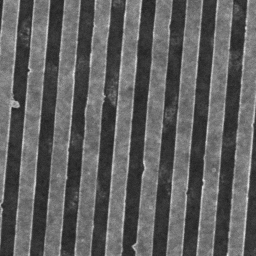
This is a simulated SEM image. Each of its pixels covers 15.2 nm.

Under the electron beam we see parallel lines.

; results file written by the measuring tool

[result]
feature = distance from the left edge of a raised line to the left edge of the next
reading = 462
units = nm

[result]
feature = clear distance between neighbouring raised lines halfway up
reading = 233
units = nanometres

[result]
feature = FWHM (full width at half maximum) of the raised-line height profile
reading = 233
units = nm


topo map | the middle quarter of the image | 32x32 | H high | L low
HHHLLLLHHHLLLLHHHHLLLLHHHHLLLHHH
HHHLLLLHHHLLLLHHHHLLLLHHHHLLLHHH
HHLLLLHHHHLLLLHHHHLLLLHHHLLLLHHH
HHLLLLHHHHLLLLHHHHLLLLHHHLLLLHHH
HHLLLLHHHHLLLLHHHHLLLLHHHLLLLHHH
HHLLLLHHHHLLLLHHHHLLLLHHHLLLLHHH
HHLLLLHHHHLLLLHHHLLLLHHHHLLLLHHH
HHLLLLHHHHLLLLHHHLLLLHHHHLLLLHHH
HHLLLLHHHHLLHLHHHLLLLHHHHLLLLHHH
HHLLLLHHHHLLLLHHHLLLLHHHHLLLLHHH
HHLLLLHHHLLLLHHHHLLLLHHHHLLLLHHH
HHLLLLHHHLLLLHHHHLLLLHHHHLLLLHHH
HHLLLHHHHLLLLHHHHLLLLHHHHLLLHHHH
HHLLLHHHHLLLLHHHHLLLLHHHHLLLHHHH
HHLLLHHHHLLLLHHHHLLLLHHHLLLLHHHH
HHLLLHHHHLLLLHHHHLLLLHHHLLLLHHHH
HHLLLHHHHLLLLHHHHLLLLHHHLLLLHHHH
HLLLLHHHHLLLLHHHHLLLLHHHLLLLHHHH
HLLLLHHHHLLLLHHHLLLLLHHHLLLLHHHH
HLLLLHHHHLLLLHHHLLLLHHHHLLLLHHHH
HLLLLHHHHLLLLHHHLLLLHHHHLLLLHHHL
HLLLLHHHHLLLLHHHLLLLHHHHLLLLHHHL
HLLLLHHHLLLLLHHHLLLLHHHHLLLLHHHL
HLLLLHHHLLLLHHHHLLLLHHHHLLLLHHHL
HLLLLHHHLLLLHHHHLLLLHHHHLLLLHHHL
HLLLLHHHLLLLHHHHLLLLHHHHLLLLHHHL
HLLLLHHHLLLLHHHHLLLLHHHHLLLLHHHL
HLLLHHHHLLLLHHHHLLLLHHHLLLLHHHHL
HLLLHHHHLLLLHHHHLLLLHHHLLLLHHHHL
LLLLHHHHLLLLHHHHLLLLHHHLLLLHHHHL
LLLLHHHHLLLLHHHHLLLLHHHLLLLHHHHL
LLLLHHHHLLLLHHHLLLLHHHHLLLLHHHHL